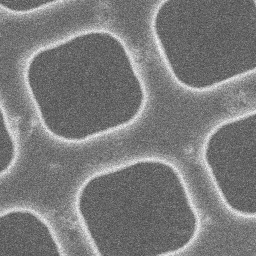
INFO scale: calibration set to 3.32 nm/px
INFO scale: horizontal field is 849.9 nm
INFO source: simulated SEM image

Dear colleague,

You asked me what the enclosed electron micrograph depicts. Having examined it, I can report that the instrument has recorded holes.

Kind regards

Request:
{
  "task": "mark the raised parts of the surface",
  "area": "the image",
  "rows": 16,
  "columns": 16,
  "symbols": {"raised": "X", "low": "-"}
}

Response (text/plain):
--XXXXXXXX------
XXXXXXXXXX------
XXXX---XXX------
XX------XX------
XX------XXX----X
XX-------XXX-XXX
XX-------XXXXXXX
XXX-----XXXXXXX-
-XXX--XXXXXXX---
-XXXXXXXXXXXX---
XXXXXXXX---XX---
XXXXX------XXX--
XXXXX-------XX--
--XXX-------XXXX
---XXX------XXXX
----XX-----XXXXX